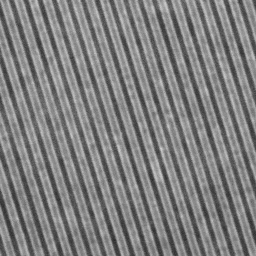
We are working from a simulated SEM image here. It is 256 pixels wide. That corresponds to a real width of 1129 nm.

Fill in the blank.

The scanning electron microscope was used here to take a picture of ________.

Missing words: parallel lines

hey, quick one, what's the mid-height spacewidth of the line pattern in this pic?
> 6.69 px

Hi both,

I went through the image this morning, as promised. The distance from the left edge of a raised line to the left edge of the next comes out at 60.2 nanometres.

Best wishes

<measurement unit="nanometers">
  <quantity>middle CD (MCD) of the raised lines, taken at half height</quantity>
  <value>29.5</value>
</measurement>